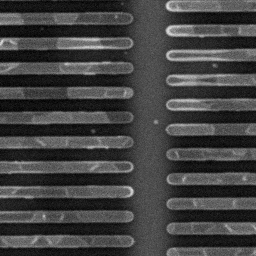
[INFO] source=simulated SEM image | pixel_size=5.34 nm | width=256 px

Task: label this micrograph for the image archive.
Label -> groups of lines, slits or small figures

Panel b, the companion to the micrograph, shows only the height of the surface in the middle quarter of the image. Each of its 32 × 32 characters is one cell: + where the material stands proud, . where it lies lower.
+++++++++++++++++...............
+++++++++++++++++...............
................................
..........................++++++
..........................++++++
................................
+++++++++++++++++...............
+++++++++++++++++...............
................................
..........................++++++
..........................++++++
................................
+++++++++++++++++...............
+++++++++++++++++...............
+++++++++++++++++...............
..........................++++++
..........................++++++
..........................++++++
+++++++++++++++++...............
+++++++++++++++++...............
+++++++++++++++++...............
...........................+++++
..........................++++++
..........................++++++
................................
+++++++++++++++++...............
+++++++++++++++++...............
...........................+++++
..........................++++++
..........................++++++
................................
+++++++++++++++++...............